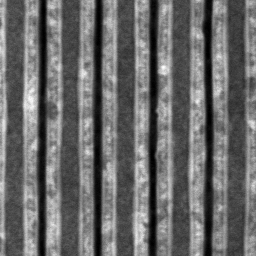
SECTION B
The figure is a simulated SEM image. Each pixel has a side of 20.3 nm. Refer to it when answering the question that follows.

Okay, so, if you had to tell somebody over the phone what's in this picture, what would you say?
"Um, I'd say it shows parallel lines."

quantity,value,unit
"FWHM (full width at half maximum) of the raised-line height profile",276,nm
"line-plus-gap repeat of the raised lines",26.9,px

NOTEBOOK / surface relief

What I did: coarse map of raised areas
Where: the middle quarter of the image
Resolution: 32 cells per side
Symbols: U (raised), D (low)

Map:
DDDDUUUDDDUUUDDDDDUUUDDUUUUDDDDD
DDDDUUUDDDUUUDDDDDUUUDDUUUUDDDDD
DDDDUUUDDDUUUDDDDDUUUDDDUUUDDDDD
DDDDUUUDDDUUUDDDDDUUUDDDUUUDDDDD
DDDDUUUDDDUUUDDDDDUUUDDDUUUDDDDD
DDDDUUUDDDUUUDDDDDUUUDDDUUUDDDDD
DDDDUUUDDDUUUDDDDDUUUDDDUUUDDDDD
DDDDUUUDDDUUUDDDDDUUUDDDUUUDDDDD
DDDDUUUDDDUUUDDDDDUUUDDDUUUDDDDD
DDDDUUUDDDUUUDDDDDUUUDDDUUUDDDDD
DDDDUUUDDDUUUDDDDDUUUDDUUUUDDDDD
DDDDUUUDDUUUUDDDDDUUUDDUUUUDDDDD
DDDDUUUDDUUUUDDDDDUUUDDDUUUDDDDD
DDDDUUUDDUUUUDDDDDUUUDDDUUUDDDDD
DDDDUUUDDDUUUDDDDDUUUDDDUUUDDDDD
DDDDUUUDDDUUUDDDDDUUUDDDUUUDDDDD
DDDDUUUDDDUUUDDDDDUUUDDDUUUDDDDD
DDDDUUUDDUUUUDDDDDUUUDDUUUUDDDDD
DDDDUUUDDUUUUDDDDDUUUDDUUUUDDDDD
DDDDUUUDDUUUUDDDDDUUUDDUUUUDDDDD
DDDDUUUDDDUUUDDDDDUUUDDUUUUDDDDD
DDDDUUUDDDUUUDDDDDUUUDDUUUUDDDDD
DDDDUUUDDDUUUDDDDDUUUDDUUUUDDDDD
DDDDUUUDDDUUUDDDDDUUUDDUUUUDDDDD
DDDDUUUDDDUUUDDDDDUUUDDUUUUDDDDD
DDDDUUUDDDUUUDDDDDUUUDDUUUUDDDDD
DDDDUUUDDDUUUDDDDDUUUDDUUUUDDDDD
DDDDUUUDDDUUUDDDDDUUUDDUUUUDDDDD
DDDDUUUDDUUUUDDDDDUUUDDUUUUDDDDD
DDDDUUUDDUUUUDDDDDUUUDDUUUUDDDDD
DDDDUUUDDUUUUDDDDDUUUDDUUUUDDDDD
DDDDUUUDDUUUUDDDDDUUUDDUUUUDDDDD